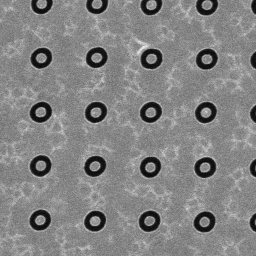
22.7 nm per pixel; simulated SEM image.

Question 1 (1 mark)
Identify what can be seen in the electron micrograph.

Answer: a regular array of ring-shaped grooves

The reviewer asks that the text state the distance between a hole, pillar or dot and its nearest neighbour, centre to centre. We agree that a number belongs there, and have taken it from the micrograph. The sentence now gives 1220 nm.